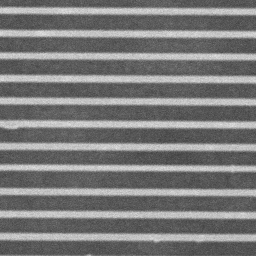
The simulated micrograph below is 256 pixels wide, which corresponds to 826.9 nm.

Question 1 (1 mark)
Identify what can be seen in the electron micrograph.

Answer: parallel lines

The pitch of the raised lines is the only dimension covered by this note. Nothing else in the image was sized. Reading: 72.9 nm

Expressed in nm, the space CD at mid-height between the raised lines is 54.4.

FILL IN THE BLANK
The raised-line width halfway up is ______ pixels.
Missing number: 5.88